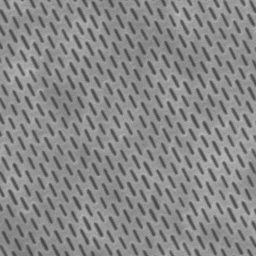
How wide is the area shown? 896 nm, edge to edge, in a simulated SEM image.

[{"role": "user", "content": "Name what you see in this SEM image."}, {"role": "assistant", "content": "a regular array of holes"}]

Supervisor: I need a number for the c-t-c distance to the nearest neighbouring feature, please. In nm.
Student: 46.3